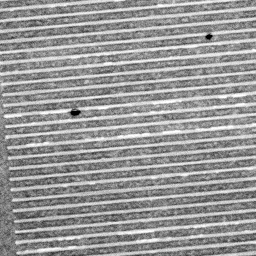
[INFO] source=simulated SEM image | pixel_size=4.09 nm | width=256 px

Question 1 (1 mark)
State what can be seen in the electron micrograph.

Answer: parallel lines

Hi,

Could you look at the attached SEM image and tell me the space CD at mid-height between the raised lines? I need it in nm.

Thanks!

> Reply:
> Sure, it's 31.5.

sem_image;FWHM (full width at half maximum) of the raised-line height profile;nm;10.7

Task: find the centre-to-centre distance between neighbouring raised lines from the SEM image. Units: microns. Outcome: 0.0433